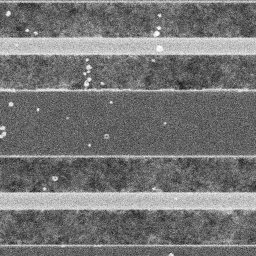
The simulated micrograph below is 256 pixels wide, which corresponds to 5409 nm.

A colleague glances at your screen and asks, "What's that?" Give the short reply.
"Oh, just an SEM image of lines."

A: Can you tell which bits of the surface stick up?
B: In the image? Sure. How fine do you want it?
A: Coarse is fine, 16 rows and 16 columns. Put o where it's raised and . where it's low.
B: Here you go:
................
................
................
................
................
................
oooooooooooooooo
oooooooooooooooo
oooooooooooooooo
oooooooooooooooo
................
................
................
................
................
oooooooooooooooo